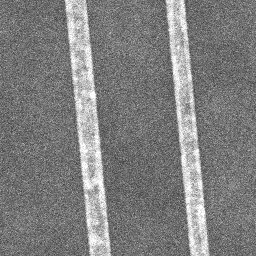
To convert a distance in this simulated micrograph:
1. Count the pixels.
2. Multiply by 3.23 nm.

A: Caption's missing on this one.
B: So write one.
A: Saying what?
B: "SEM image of one or a few lines or trenches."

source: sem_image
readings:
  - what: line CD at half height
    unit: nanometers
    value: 50.4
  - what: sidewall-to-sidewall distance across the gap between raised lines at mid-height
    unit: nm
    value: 268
